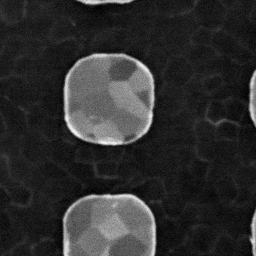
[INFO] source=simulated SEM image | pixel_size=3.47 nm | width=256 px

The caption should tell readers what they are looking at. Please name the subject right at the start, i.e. raised bodies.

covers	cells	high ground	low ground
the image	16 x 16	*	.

................
................
................
......**........
....*****.......
....******......
....******......
....*****.......
.....****.......
................
................
................
.....****.......
....*****.......
....******......
....******......